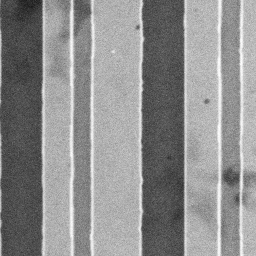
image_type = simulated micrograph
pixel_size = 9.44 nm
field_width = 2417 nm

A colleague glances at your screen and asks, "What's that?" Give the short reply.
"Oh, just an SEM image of lines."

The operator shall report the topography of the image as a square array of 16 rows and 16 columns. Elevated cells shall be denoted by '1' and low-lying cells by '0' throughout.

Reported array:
0001111110001111
0001111110001111
0001111110001111
0001111110001111
0001111110001111
0001111110001111
0001111110001111
0001111110001111
0001111110001111
0001111110001111
0001111110001111
0001111110001111
0001111110001111
0001111110001111
0001111110001111
0001111110001111